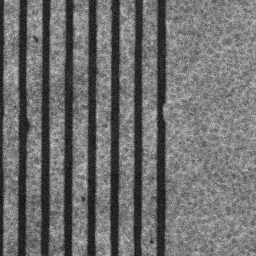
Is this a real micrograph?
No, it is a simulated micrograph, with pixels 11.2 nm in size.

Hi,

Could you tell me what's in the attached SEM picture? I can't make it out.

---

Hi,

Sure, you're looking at parallel lines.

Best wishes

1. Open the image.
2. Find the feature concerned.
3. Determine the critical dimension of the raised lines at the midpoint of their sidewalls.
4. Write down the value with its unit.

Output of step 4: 165 nm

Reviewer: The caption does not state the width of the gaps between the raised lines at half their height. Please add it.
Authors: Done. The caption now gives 96.5 nm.